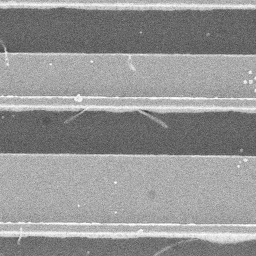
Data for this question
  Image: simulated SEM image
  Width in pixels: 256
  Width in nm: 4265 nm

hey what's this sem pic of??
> lines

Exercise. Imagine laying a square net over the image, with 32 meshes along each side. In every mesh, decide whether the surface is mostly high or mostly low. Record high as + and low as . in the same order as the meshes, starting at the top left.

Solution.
++++++++++++++++++++++++++++++++
................................
................................
................................
................................
................................
................................
++++++++++++++++++++++++++++++++
++++++++++++++++++++++++++++++++
++++++++++++++++++++++++++++++++
++++++++++++++++++++++++++++++++
++++++++++++++++++++++++++++++++
++++++++++++++++++++++++++++++++
..........+...++++++++++++++++++
................................
................................
................................
................................
................................
++++++++++++++++................
++++++++++++++++++++++++++++++++
++++++++++++++++++++++++++++++++
++++++++++++++++++++++++++++++++
++++++++++++++++++++++++++++++++
++++++++++++++++++++++++++++++++
++++++++++++++++++++++++++++++++
++++++++++++++++++++++++++++++++
++++++++++++++++++++++++++++++++
++++++++++++++++++++++++++++++++
...........................+.+..
................................
................................